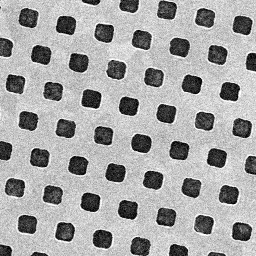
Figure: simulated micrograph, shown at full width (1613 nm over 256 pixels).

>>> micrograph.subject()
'a regular array of holes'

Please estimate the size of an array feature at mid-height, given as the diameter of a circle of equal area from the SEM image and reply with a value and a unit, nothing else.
0.13 microns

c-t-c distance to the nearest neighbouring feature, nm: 242